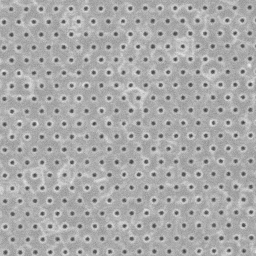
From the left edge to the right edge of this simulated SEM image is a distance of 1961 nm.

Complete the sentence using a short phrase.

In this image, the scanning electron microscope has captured a regular array of holes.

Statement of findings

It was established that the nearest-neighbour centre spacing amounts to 111 nm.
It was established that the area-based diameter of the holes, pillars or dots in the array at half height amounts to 37.7 nanometres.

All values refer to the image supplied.